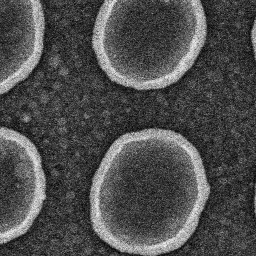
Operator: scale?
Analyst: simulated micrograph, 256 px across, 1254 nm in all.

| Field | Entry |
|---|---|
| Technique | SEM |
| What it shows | raised bodies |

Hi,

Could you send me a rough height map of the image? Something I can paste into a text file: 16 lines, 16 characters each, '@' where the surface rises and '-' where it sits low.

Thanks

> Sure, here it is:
@@-----@@@@@----
@@@---@@@@@@@---
@@@---@@@@@@----
@@----@@@@@@----
@@-----@@@@-----
----------------
----------------
----------------
@-------@@@-----
@@-----@@@@@----
@@----@@@@@@@---
@@@---@@@@@@@---
@@@---@@@@@@@---
@@----@@@@@@----
@-----@@@@@@----
--------@@------